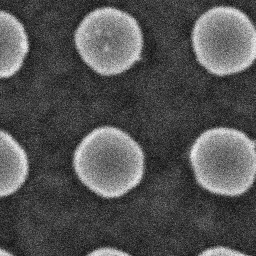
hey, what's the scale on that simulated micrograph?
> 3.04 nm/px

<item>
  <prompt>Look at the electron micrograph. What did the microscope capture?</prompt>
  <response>raised bodies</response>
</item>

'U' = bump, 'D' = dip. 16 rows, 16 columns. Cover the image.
DDDDDDDDDDDDDDDD
UDDDDUUUDDDDUUUU
UUDDDUUUUDDDUUUU
UUDDDUUUUDDDUUUU
UDDDDDUDDDDDDUUD
DDDDDDDDDDDDDDDD
DDDDDDDDDDDDDDDD
DDDDDDDDDDDDDDDD
DDDDDDUUDDDDDUUD
UDDDDUUUUDDDUUUU
UUDDDUUUUDDDUUUU
UDDDDUUUDDDDDUUU
DDDDDDDDDDDDDDDD
DDDDDDDDDDDDDDDD
DDDDDDDDDDDDDDDD
DDDDDDDDDDDDDDDD